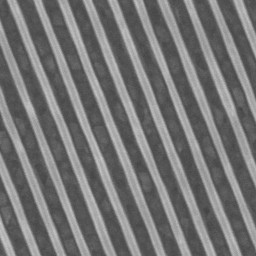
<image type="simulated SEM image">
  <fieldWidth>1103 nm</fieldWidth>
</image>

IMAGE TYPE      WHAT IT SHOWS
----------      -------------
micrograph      parallel lines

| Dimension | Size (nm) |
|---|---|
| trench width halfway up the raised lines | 70.3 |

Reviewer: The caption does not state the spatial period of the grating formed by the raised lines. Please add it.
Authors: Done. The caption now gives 101 nanometers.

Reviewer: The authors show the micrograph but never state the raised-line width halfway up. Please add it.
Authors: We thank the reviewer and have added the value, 31.2 nanometers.